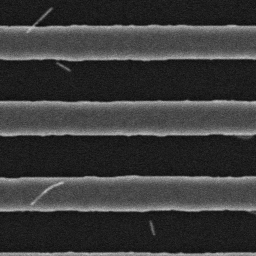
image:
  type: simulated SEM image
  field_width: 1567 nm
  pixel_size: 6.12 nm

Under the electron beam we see lines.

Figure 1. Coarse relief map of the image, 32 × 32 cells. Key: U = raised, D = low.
DDDDDDDDDDDDDDDDDDDDDDDDDDDDDDDD
DDDDDDDDDDDDDDDDDDDDDDDDDDDDDDDD
DDDDDDDDDDDDDDDDDDDDDDDDDDDDDDDD
UUUUUUUUUUUUUUUUUUUUUUUUUUUUUUUU
UUUUUUUUUUUUUUUUUUUUUUUUUUUUUUUU
UUUUUUUUUUUUUUUUUUUUUUUUUUUUUUUU
UUUUUUUUUUUUUUUUUUUUUUUUUUUUUUUU
DDDDDDDDUUUDDDDDDUUDDDDDDDDDDDDD
DDDDDDDDDDDDDDDDDDDDDDDDDDDDDDDD
DDDDDDDDDDDDDDDDDDDDDDDDDDDDDDDD
DDDDDDDDDDDDDDDDDDDDDDDDDDDDDDDD
DDDDDDDDDDDDDDDDDDDDDDDDDDDDDDDD
DDDDDDDDDDDDDDDDDDDDDDDDDDDDDDDD
UUUUUUUUUUUUUUUUUUUUUUUUUUUUUUUU
UUUUUUUUUUUUUUUUUUUUUUUUUUUUUUUU
UUUUUUUUUUUUUUUUUUUUUUUUUUUUUUUU
UUUUUUUUUUUUUUUUUUUUUUUUUUUUUUUU
DDDDDDDDDDDDDDDDDDDDDDDDDDDDDDDD
DDDDDDDDDDDDDDDDDDDDDDDDDDDDDDDD
DDDDDDDDDDDDDDDDDDDDDDDDDDDDDDDD
DDDDDDDDDDDDDDDDDDDDDDDDDDDDDDDD
DDDDDDDDDDDDDDDDDDDDDDDDDDDDDDDD
UUUUUUUUUUUUUUUUUUUUUUUUUUUUUUUU
UUUUUUUUUUUUUUUUUUUUUUUUUUUUUUUU
UUUUUUUUUUUUUUUUUUUUUUUUUUUUUUUU
UUUUUUUUUUUUUUUUUUUUUUUUUUUUUUUU
DDDDDDDDDDDDDDDDDUDDDDDDDDDDDDDD
DDDDDDDDDDDDDDDDDDDDDDDDDDDDDDDD
DDDDDDDDDDDDDDDDDDDDDDDDDDDDDDDD
DDDDDDDDDDDDDDDDDDDDDDDDDDDDDDDD
DDDDDDDDDDDDDDDDDDDDDDDDDDDDDDDD
DDDDDDDDDDDDDDDDDDDDDDDDDDDDDDDD